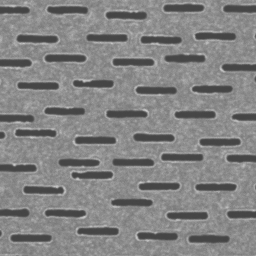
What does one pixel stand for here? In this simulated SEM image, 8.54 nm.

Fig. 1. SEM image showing a regular array of holes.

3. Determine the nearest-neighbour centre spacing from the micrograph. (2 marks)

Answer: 299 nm